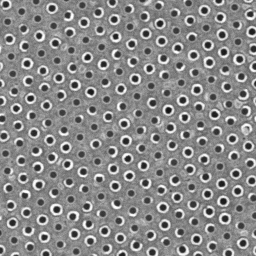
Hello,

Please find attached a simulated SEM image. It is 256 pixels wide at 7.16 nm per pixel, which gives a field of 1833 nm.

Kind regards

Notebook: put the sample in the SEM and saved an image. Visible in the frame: a regular array of holes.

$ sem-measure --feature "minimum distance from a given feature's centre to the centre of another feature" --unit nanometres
123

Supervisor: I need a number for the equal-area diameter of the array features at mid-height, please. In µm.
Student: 0.0517